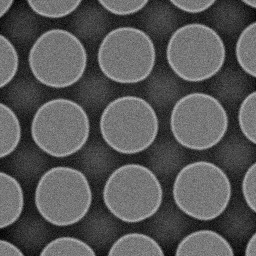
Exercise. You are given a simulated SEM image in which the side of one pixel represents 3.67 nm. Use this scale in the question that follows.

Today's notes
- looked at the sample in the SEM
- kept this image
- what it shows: an array of small figures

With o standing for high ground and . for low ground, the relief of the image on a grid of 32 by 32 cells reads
o...oooooo...ooooo....oooo.....o
o....oooo.....ooo...............
................................
.......................ooo.....o
.....oooo....ooooo....ooooo...oo
o...oooooo...oooooo..ooooooo..oo
oo..ooooooo.ooooooo..ooooooo..oo
oo..ooooooo.ooooooo..ooooooo..oo
oo..ooooooo..oooooo...ooooo...oo
oo..oooooo....oooo.....ooo......
o.....ooo.......................
................................
...............ooo.....oooo....o
o....ooooo...oooooo...oooooo..oo
oo..ooooooo..oooooo...oooooo..oo
oo..ooooooo..ooooooo.ooooooo..oo
oo..ooooooo..ooooooo..oooooo...o
oo..ooooooo..oooooo...ooooo....o
oo...ooooo....oooo......oo......
.......o........................
........................oo......
......oooo....ooooo....ooooo...o
oo...oooooo...oooooo..oooooo...o
oo...oooooo..ooooooo..ooooooo.oo
ooo..oooooo..ooooooo..ooooooo..o
ooo..oooooo..ooooooo..oooooo...o
ooo..oooooo...ooooo....ooooo....
oo....oooo......o...............
................................
................oo......ooo.....
o.....ooooo...oooooo...ooooo...o
oo...ooooooo..oooooo..ooooooo..o